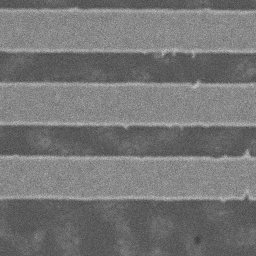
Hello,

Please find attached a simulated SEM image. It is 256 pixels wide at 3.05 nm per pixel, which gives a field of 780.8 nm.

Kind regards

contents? one or a few lines or trenches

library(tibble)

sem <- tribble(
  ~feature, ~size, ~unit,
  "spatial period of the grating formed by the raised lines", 224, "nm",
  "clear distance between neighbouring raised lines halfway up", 0.0999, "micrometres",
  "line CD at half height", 124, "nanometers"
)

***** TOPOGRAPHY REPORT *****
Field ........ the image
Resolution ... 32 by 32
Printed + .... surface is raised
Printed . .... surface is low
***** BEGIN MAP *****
................................
++++++++++++++++++++++++++++++++
++++++++++++++++++++++++++++++++
++++++++++++++++++++++++++++++++
++++++++++++++++++++++++++++++++
++++++++++++++++++++++++++++++++
....................+...+......+
................................
................................
................................
++++++++.......+++......+.......
++++++++++++++++++++++++++++++++
++++++++++++++++++++++++++++++++
++++++++++++++++++++++++++++++++
++++++++++++++++++++++++++++++++
++..+.++++++++.+++++++++++++++++
................................
................................
................................
..............................+.
++++++++++++++++++++++++++++++++
++++++++++++++++++++++++++++++++
++++++++++++++++++++++++++++++++
++++++++++++++++++++++++++++++++
++++++++++++++++++++++++++++++++
................................
................................
................................
................................
................................
................................
...............+................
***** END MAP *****